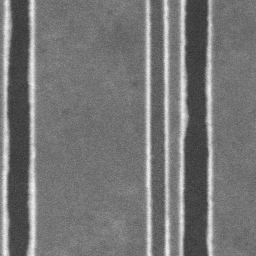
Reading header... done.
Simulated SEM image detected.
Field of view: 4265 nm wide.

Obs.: lines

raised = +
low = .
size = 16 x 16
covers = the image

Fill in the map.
..+++++++++..+++
..+++++++++..+++
..+++++++++..+++
..+++++++++..+++
..+++++++++..+++
..+++++++++..+++
..++++++++++.+++
..++++++++++.+++
..+++++++++..+++
..+++++++++..+++
..+++++++++..+++
..+++++++++..+++
..+++++++++..+++
..+++++++++..+++
..+++++++++..+++
..+++++++++..+++